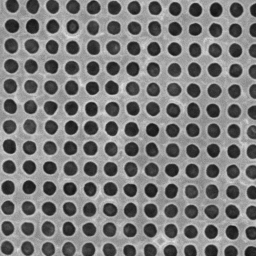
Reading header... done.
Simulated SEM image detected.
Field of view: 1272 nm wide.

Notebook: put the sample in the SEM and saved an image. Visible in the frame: a regular array of holes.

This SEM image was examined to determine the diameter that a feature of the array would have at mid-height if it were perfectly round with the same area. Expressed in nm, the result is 68.7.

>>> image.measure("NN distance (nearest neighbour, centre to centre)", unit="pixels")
19.8